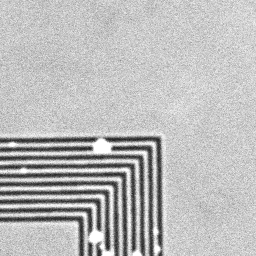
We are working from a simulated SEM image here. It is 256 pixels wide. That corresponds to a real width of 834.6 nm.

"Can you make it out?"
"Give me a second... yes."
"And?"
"groups of lines, slits or small figures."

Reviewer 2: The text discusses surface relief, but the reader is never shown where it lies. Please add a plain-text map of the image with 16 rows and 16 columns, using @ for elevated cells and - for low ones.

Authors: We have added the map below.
@@@@@@@@@@@@@@@@
@@@@@@@@@@@@@@@@
@@@@@@@@@@@@@@@@
@@@@@@@@@@@@@@@@
@@@@@@@@@@@@@@@@
@@@@@@@@@@@@@@@@
@@@@@@@@@@@@@@@@
@@@@@@@@@@@@@@@@
@@@@@@@@@@@@@@@@
------@---@@@@@@
----------@@@@@@
----------@@@@@@
----------@@@@@@
----------@@@@@@
@@@@@-----@@@@@@
@@@@@-----@@@@@@